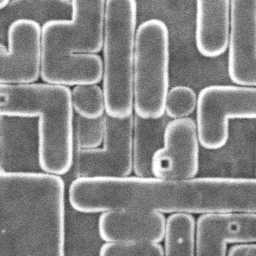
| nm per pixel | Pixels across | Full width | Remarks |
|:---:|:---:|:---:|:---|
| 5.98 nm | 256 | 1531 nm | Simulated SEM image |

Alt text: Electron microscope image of wiring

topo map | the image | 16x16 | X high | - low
-----XXX----XXXX
-X-XXXXXXX--XXXX
-XXXXXXXXX--XXXX
XXXXXXXXXX----XX
XXXXXXXXXX----XX
XXXXXXXXXX---XXX
XXXXXXXXXX--XXXX
--XX--------XX--
--XX------XXXX--
--XX------XX----
---X------XX----
XXXX-XXXXXXXXXXX
XXXXXXXXXXXXXXXX
XXXX--XXXXXXXXXX
XXXX--XXXXXXXXXX
XXXX--XXXXXXXXXX